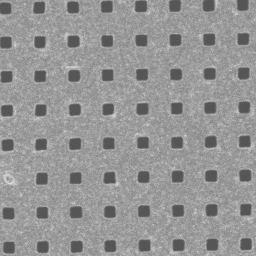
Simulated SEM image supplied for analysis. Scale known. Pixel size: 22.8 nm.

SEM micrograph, a regular array of holes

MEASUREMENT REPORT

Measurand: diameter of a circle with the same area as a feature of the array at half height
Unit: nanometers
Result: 302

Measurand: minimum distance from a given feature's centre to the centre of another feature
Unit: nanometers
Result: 770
